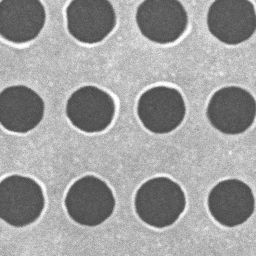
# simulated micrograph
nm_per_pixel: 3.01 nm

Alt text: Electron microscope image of holes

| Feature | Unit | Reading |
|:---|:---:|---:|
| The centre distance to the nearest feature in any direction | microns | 0.214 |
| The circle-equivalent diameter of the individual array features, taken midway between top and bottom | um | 0.142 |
